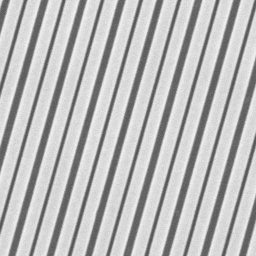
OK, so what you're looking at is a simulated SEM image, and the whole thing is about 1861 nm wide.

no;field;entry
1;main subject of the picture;parallel lines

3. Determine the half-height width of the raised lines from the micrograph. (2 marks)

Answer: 12.2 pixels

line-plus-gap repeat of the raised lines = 18.5 px